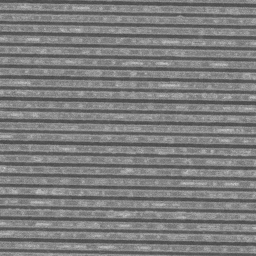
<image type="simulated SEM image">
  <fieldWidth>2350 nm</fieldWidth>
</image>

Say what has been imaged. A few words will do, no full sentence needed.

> parallel lines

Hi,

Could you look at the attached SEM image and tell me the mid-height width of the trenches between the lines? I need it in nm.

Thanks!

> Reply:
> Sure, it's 40.2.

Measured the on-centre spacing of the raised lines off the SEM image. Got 99.6 nanometers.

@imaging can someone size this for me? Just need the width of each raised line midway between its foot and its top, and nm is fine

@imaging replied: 64.3